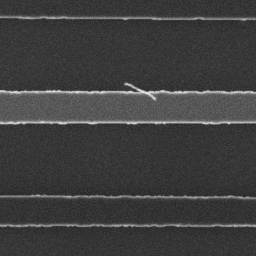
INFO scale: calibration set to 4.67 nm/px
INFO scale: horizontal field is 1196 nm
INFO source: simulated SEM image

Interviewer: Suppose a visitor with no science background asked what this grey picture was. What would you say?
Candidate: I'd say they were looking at lines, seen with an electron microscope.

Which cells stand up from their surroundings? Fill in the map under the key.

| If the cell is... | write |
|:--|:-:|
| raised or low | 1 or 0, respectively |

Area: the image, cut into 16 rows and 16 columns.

1111111111111111
0000000000000000
0000000000000000
0000000000000000
0000000000000000
0000000000000000
1111111111111111
1111111111111111
0000000000000000
0000000000000000
0000000000000000
0000000000000000
1111111111111111
1111111111111111
0000000000000000
0000000000000000